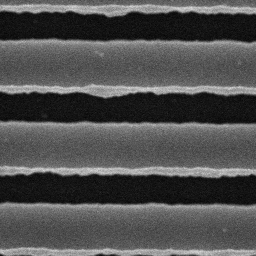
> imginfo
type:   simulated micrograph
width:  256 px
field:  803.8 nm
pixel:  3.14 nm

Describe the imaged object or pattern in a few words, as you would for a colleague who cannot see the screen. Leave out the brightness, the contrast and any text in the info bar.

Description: lines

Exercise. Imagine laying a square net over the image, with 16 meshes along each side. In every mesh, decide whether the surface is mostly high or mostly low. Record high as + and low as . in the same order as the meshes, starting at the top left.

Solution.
++++++++++++++++
................
................
++++++++++++++++
++++++++++++++++
++++++++++++++++
................
................
++++++++++++++++
++++++++++++++++
++++++++++++++++
................
................
++++++++++++++++
++++++++++++++++
++++++++++++++++